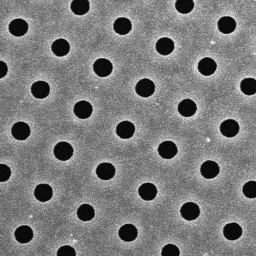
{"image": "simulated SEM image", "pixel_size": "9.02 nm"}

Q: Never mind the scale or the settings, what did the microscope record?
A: a regular array of holes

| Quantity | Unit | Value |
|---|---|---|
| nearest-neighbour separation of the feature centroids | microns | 0.414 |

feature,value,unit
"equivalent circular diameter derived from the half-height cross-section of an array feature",0.174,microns